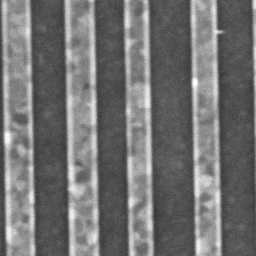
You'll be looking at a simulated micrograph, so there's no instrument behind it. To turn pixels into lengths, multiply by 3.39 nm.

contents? one or a few lines or trenches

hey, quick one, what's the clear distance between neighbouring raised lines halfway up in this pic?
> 132 nm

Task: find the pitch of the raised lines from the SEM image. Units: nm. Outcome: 212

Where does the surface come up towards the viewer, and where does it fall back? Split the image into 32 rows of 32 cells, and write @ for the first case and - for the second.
@@@-----@@@-----@@------@@@-----
@@@@----@@@-----@@------@@@-----
-@@@----@@@@----@@------@@@-----
-@@@----@@@@----@@------@@@-----
-@@@----@@@@----@@------@@@-----
-@@@----@@@@----@@------@@@-----
-@@@----@@@@----@@------@@@-----
-@@@----@@@@----@@------@@@-----
-@@@-----@@@----@@------@@@-----
-@@@-----@@@----@@------@@@-----
-@@@-----@@@----@@------@@@-----
-@@@-----@@@----@@------@@@-----
-@@@-----@@@----@@------@@@-----
-@@@-----@@@----@@------@@@-----
-@@@-----@@@----@@@-----@@@-----
-@@@-----@@@----@@@-----@@@-----
-@@@-----@@@----@@@-----@@@-----
-@@@-----@@@----@@@-----@@@-----
-@@@-----@@@----@@@-----@@@-----
-@@@-----@@@----@@@------@@-----
-@@@-----@@@----@@@------@@-----
-@@@-----@@@----@@@------@@-----
-@@@-----@@@----@@@------@@-----
-@@@-----@@@----@@@------@@-----
-@@@-----@@@----@@@------@@-----
-@@@-----@@@----@@@------@@-----
-@@@-----@@@----@@@------@@-----
-@@@-----@@@----@@@------@@-----
-@@@-----@@@----@@@------@@-----
-@@@-----@@@----@@@------@@-----
-@@@-----@@@----@@@------@@-----
-@@@-----@@@----@@@------@@-----